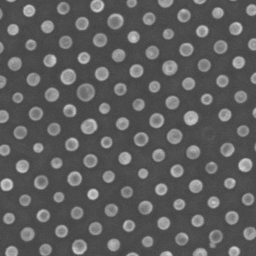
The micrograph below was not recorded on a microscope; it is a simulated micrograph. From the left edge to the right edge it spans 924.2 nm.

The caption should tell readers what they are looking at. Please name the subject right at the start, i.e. a regular array of raised bodies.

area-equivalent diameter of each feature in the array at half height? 42.7 nm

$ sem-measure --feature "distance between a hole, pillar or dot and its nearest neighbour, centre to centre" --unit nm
86.1